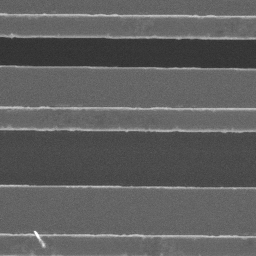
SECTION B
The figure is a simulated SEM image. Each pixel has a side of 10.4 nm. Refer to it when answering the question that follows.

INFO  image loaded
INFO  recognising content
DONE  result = lines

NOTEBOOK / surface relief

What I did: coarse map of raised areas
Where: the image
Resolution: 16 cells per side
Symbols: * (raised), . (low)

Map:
****************
****************
................
................
****************
****************
****************
****************
................
................
................
................
****************
****************
****************
****************